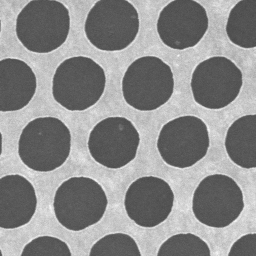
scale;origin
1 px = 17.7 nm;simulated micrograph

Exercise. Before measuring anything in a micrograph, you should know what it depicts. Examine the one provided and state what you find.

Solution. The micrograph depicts a regular array of holes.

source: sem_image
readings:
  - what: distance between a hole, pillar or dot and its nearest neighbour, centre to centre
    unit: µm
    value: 1.22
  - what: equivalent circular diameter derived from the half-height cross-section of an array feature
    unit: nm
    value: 937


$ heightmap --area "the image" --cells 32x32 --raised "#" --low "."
###.....####....#####....#####..
###......##......###......###...
##.......##......###......##....
##.......#.......###......##....
##......###......###.....####...
###.....####....#####....####...
####..##########################
...#####....#####...######...###
....###......###.....###......##
....###......##.......##......##
.....##......##.......##......##
....###......##.......##......##
....###.....####.....###.....###
...#####...######...######..####
#######################.#######.
###.....####.....####.....###...
###......##......###......##....
##.......##......###......##....
##.......##......###......##....
##.......##......###......###...
###.....####....#####...######..
#####.##########################
...#####....#####...#####....###
....###......###.....####.....##
.....##......###......##......##
.....##......###......##......##
....###......###.....###......##
....###.....#####....####....###
..######...################.####
#####.#######...######...#####..
###.....####.....###......###...
###......##.......##......###...